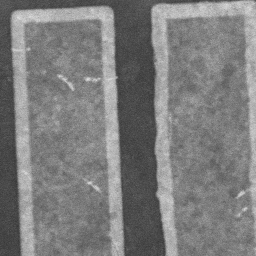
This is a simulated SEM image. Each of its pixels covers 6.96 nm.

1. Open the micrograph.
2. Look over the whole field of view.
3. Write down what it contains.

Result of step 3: one or a few lines or trenches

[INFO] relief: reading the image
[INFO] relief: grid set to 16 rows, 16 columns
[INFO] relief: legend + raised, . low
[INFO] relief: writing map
..............+.
.++++++...++++++
.++++++...++++++
.++++++...++++++
.++++++...++++++
.++++++...++++++
.++++++...++++++
.++++++...++++++
.++++++...++++++
..+++++...++++++
..+++++...++++++
..+++++...++++++
..+++++...++++++
..+++++....+++++
..+++++....+++++
..+++++....+++++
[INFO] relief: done